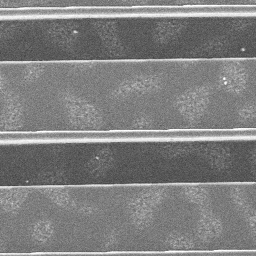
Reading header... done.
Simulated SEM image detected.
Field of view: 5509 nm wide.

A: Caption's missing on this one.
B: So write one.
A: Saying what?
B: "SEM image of lines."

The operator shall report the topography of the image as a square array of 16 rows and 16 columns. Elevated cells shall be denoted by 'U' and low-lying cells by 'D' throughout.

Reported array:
UUUUUUUUUUUUUUUU
DDDDDDDDDDDDDDDD
DDDDDDDDDDDDDDDD
DDDDDDDDDDDDDDDD
UUUUUUUUUUUUUUUU
UUUUUUUUUUUUUUUU
UUUUUUUUUUUUUUUU
UUUUUUUUUUUUUUUU
UUUUUUUUUUUUUUUU
DDDDDDDDDDDDDDDD
DDDDDDDDDDDDDDDD
DDDDDDDDDDDDUUUU
UUUUUUUUUUUUUUUU
UUUUUUUUUUUUUUUU
UUUUUUUUUUUUUUUU
UUUUUUUUUUUUUUUU